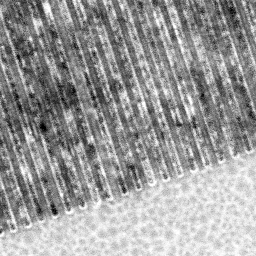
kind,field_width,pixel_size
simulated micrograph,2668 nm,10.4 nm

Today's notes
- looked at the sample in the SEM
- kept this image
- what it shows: parallel lines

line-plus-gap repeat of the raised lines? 152 nm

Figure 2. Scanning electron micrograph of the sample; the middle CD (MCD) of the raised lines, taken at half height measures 5.93 px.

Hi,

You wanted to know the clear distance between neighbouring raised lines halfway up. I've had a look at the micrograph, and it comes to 82.8 nm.